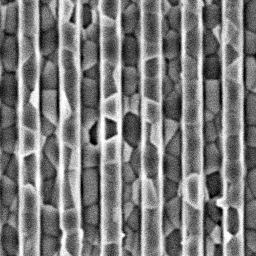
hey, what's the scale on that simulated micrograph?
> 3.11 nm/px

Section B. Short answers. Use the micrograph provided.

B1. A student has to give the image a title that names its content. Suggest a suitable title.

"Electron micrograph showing parallel lines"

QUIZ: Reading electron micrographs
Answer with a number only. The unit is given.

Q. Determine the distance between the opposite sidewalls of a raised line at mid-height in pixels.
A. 19.9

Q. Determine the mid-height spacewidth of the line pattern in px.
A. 20.8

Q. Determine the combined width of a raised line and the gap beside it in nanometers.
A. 127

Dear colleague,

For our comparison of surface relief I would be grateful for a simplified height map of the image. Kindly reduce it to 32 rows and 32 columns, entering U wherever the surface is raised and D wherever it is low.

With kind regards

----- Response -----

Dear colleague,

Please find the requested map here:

DDUUUDDUUUDDUUUDDDUUDDDUUDDDUUDD
DDUUUDDDUUDDDUUDDDUUDDDUUDDDUUDD
DDUUUDDUUUDDDUUDDDUUDDDUUDDDUUDD
DDUUUDDUUUDDDUUDDDUUDDDUUDDDUUDD
DDUUUDDDUUDDDUUDDDUUDDDUUDDDUUDD
DDUUUDDUUUDDDUUDDDUUDDDUUDDDUUDD
DDUUUDDUUUDDDUUDDDUUDDDUUDDDUUDD
DDUUUDDUUUDDDUUDDDUUDDDUUDDDUUDD
DDUUUDDUUUDDDUUDDDUUDDDUUDDDUUDD
DDUUUDDUUUDDDUUDDDUUDDDUUDDDUUDD
DDUUUDDDUUDDDUUDDDUUDDDUUDDDUUDD
DDUUUDDDUUDDDUUDDDUUDDDUUDDDUUDD
DDUUUDDUUUDDDUUDDDUUDDDUUDDDUUDD
DDUUUDDUUUDDDUUDDDUUDDDUUDDDUUDD
DDDUUDDDUUDDDUUDDDUUDDDUUDDDUUDD
DDUUUDDDUUDDDUUDDDUUDDDUUDDDUUDD
DDUUUDDUUUDDDUUDDDUUDDDUUDDDUUDD
DDUUUDDUUUDDDUUDDDUUDDDUUDDDUUDD
DDUUUDDDUUDDDUUDDDUUDDDUUDDDUUDD
DDUUUDDDUUDDDUUDDDUUDDDUUDDDUUDD
DDUUUDDDUUDDDUUDDDUUDDDUUDDDUUDD
DDUUUDDDUUDDDUUDDDUUDDDUUDDDUUDD
DDUUUDDDUUDDDUUDDDUUDDDUUDDDUUDD
DDUUUDDDUUDDDUUDDDUUDDDUUDDDUUDD
DDUUUDDDUUDDDUUDDDUUDDDUUDDDUUDD
DDUUUDDDUUDDDUUDDDUUDDDUUDDUUUDD
DDUUUDDDUUDDDUUDDDUUDDDUUDDDUUDD
DDUUUDDDUUDDDUUDDDUUDDDUUDDDUUDD
DDUUUDDDUUDDDUUDDDUUDDDUUDDDUUDD
DDUUUDDDUUDDDUUDDDUUDDDUUDDDUUDD
DDUUUDDDUUDDDUUDDDUUDDDUUDDDUUDD
DDUUUDDDUUDDDUUDDDUUDDDUUDDDUUDD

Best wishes